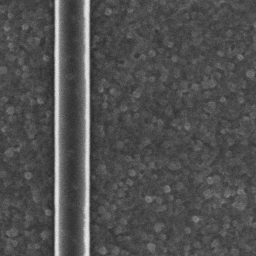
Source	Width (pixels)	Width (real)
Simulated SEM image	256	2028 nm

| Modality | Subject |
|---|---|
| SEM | one or a few lines or trenches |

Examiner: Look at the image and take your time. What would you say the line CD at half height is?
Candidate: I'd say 244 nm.